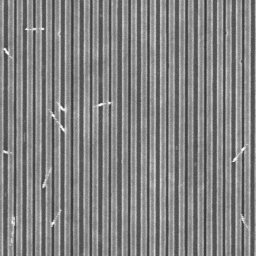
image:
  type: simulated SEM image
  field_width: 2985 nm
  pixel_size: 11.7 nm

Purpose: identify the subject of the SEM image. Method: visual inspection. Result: parallel lines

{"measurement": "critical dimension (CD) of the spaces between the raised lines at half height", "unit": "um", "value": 0.0569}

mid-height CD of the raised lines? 68.5 nanometres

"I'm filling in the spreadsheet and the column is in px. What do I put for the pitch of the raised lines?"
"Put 9.47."